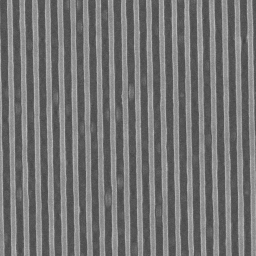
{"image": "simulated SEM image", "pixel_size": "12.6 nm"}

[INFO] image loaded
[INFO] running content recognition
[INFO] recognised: parallel lines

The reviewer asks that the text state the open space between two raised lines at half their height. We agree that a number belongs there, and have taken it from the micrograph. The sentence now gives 97.7 nanometres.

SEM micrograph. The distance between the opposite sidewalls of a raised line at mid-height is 61.5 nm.